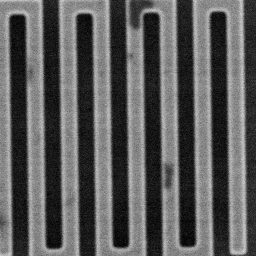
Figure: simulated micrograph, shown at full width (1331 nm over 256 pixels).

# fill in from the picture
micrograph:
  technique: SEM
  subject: groups of lines, slits or small figures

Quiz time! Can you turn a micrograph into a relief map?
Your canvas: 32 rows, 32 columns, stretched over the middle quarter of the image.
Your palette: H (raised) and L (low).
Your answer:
HHHLLLLLHHHLLLLLHHHHLLLLHHHHLLLL
HHHLLLLLHHHLLLLLHHHHLLLLHHHHLLLL
HHHLLLLLHHHLLLLLHHHHLLLLHHHHLLLL
HHHLLLLLHHHLLLLLHHHHLLLLHHHHLLLL
HHHLLLLLHHHLLLLLHHHHLLLLHHHHLLLL
HHHLLLLLHHHLLLLLHHHHLLLLHHHHLLLL
HHHLLLLLHHHLLLLLHHHHLLLLHHHHLLLL
HHHLLLLLHHHLLLLLHHHHLLLLHHHHLLLL
HHHLLLLLHHHLLLLLHHHHLLLLHHHHLLLL
HHHLLLLLHHHLLLLLHHHHLLLLLHHHLLLL
HHHLLLLLHHHLLLLLHHHHLLLLLHHHLLLL
HHHLLLLLHHHLLLLLHHHHLLLLLHHHLLLL
HHHLLLLLHHHLLLLLHHHHLLLLLHHHLLLL
HHHLLLLLHHHLLLLLHHHHLLLLLHHHLLLL
HHHLLLLLHHHLLLLLHHHHLLLLLHHHLLLL
HHHLLLLLHHHLLLLLHHHHLLLLLHHHLLLL
HHHLLLLLHHHHLLLLHHHHLLLLLHHHLLLL
HHHLLLLLHHHHLLLLHHHHLLLLLHHHLLLL
HHHLLLLLHHHHLLLLHHHHLLLLLHHHLLLL
HHHLLLLLHHHHLLLLHHHHLLLLLHHHLLLL
HHHLLLLLHHHHLLLLHHHHLLLLLHHHLLLL
HHHLLLLLHHHHLLLLHHHHLLLLLHHHLLLL
HHHLLLLLHHHHLLLLHHHHLLLLLHHHLLLL
HHHLLLLLHHHHLLLLHHHHLLLLLHHHLLLL
HHHLLLLLHHHHLLLLHHHHLLLLLHHHLLLL
HHHLLLLLHHHHLLLLHHHHLLLLLHHHLLLL
HHHLLLLLHHHHLLLLHHHHLLLLLHHHLLLL
HHHLLLLLHHHHLLLLHHHHLLLLLHHHLLLL
HHHLLLLLHHHHLLLLHHHHLLLLLHHHLLLL
HHHLLLLLHHHHLLLLHHHHLLLLLHHHHLLL
HHHLLLLLHHHHLLLLHHHHLLLLLHHHHLLL
HHHLLLLLHHHHLLLLHHHHLLLLLHHHHLLL